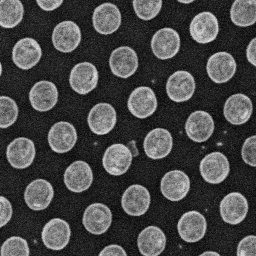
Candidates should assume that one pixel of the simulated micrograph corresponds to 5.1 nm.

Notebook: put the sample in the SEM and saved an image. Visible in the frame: a regular array of raised bodies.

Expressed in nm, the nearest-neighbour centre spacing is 219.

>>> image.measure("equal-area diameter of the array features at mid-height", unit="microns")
0.15